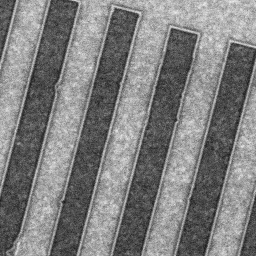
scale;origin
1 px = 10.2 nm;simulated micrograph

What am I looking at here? one or a few lines or trenches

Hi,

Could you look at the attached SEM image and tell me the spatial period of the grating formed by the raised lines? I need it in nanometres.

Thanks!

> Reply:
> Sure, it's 624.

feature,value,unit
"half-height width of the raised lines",298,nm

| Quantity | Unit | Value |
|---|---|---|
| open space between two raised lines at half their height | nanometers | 327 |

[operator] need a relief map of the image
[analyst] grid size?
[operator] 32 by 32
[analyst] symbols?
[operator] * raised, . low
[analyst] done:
**....****......................
**....****....***...............
**....***.....***...............
*....****....****....*..........
*....****....****....****.......
*....****....****....****....**.
.....***.....***.....***....****
....****....****....****....****
....****....****....****....****
....****....****....****....****
....***.....***....****....****.
...****....****....****....****.
...****....****....****....****.
...****....****....****....****.
..****.....***.....***....****..
..****....****....****....****..
..****....****....****....****..
..****....***.....****....***...
.****....****....****....****...
.****....****....****....****...
.****....****....****....****...
.****....***.....****....***....
****....****....****....****....
****....****....****....****....
****....****....****....****....
****....***.....***.....***....*
***....****....****....****....*
***....****....****....****....*
***....****....****....****....*
**.....***.....***.....***....**
**....****....****....****....**
*.....****....****....****....**